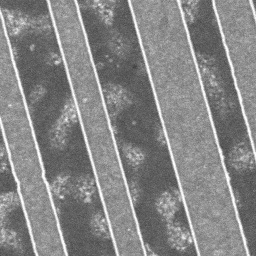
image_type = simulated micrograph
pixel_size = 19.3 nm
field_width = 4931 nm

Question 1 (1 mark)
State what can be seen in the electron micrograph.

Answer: one or a few lines or trenches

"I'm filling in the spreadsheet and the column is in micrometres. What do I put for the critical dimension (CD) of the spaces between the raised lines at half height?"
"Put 0.952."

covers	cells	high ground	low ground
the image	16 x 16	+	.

...++...+++..+++
...++...++++..++
+...+....+++..++
+...++...+++..++
+...++...+++...+
+...++....+++..+
++...++...+++..+
++...++...+++..+
++...++...+++...
++....+....+++..
.++...++...+++..
.++...++...+++..
.++...++...++++.
..++...+....+++.
..++...++...+++.
..++...++...+++.